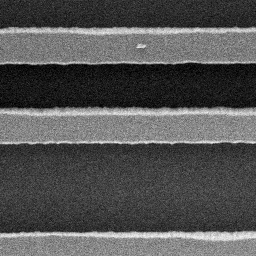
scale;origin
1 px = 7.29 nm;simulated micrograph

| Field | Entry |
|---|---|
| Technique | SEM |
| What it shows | lines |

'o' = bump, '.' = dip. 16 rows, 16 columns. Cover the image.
................
................
oooooooooooooooo
oooooooooooooooo
................
................
................
oooooooooooooooo
oooooooooooooooo
................
................
................
................
................
................
oooooooooooooooo